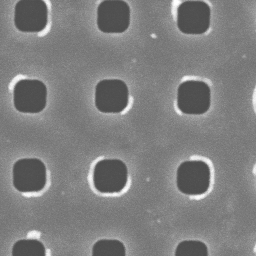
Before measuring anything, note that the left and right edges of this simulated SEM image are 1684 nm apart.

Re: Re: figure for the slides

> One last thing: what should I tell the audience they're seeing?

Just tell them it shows holes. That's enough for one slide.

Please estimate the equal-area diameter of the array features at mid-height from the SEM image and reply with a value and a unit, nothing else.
35.8 pixels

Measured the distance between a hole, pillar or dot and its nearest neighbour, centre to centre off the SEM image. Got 0.523 microns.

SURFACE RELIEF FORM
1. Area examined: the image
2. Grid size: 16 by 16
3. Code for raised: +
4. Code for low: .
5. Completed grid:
+..+++..+++..+++
+..+++..+++..+++
++++++++++++++++
++++++++++++++++
++++++++++++++++
+..+++..+++..+++
+..+++..+++..+++
++++++++++++++++
++++++++++++++++
++++++++++++++++
+..+++..+++..+++
+..+++..+++..+++
++++++++++++++++
++++++++++++++++
++++++++++++++++
+..+++..+++..+++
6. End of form